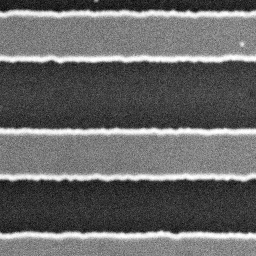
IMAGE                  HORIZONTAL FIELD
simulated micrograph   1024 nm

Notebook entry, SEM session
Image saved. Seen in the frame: lines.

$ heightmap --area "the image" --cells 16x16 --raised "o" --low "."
................
oooooooooooooooo
oooooooooooooooo
oooooooooooooooo
................
................
................
................
oooooooooooooooo
oooooooooooooooo
oooooooooooooooo
................
................
................
................
oooooooooooooooo